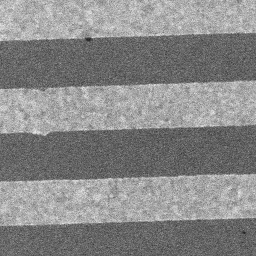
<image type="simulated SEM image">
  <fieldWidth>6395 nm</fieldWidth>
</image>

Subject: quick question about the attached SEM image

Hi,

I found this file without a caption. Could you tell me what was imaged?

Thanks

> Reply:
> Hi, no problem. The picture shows one or a few lines or trenches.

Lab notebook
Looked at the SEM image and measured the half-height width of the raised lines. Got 1.08 micrometres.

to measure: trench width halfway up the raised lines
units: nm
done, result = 1240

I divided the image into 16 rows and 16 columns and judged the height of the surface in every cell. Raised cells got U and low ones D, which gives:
UUUUUUUUUUUUUUUU
UUUUUUUUUUUUUUUU
UDDDDDDDDDDDDDDD
DDDDDDDDDDDDDDDD
DDDDDDDDDDDDDDDD
DDDDUUUUUUUUUUUU
UUUUUUUUUUUUUUUU
UUUUUUUUUUUUUUUU
DDDDDDDDDDDDDDDD
DDDDDDDDDDDDDDDD
DDDDDDDDDDDDDDDD
UUUUUUUUUUUUUUUU
UUUUUUUUUUUUUUUU
UUUUUUUUUUUUUUUU
DDDDDDDDDDDDDDDD
DDDDDDDDDDDDDDDD